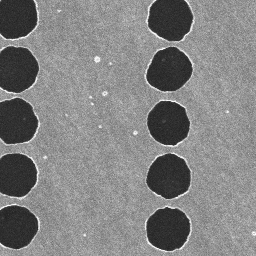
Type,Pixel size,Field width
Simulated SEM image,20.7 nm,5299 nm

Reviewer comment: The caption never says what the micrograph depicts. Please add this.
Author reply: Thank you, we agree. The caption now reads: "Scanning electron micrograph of holes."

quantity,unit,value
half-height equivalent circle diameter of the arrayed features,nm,912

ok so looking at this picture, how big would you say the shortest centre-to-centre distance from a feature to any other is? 1.09 µm